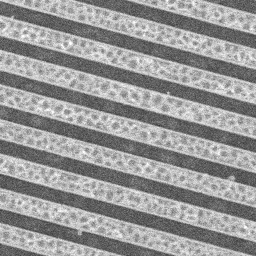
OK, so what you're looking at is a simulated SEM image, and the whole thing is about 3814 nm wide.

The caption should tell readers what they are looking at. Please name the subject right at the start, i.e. parallel lines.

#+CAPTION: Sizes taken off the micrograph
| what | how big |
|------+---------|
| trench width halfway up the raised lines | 0.225 um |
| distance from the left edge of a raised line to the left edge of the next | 0.498 microns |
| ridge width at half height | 275 nm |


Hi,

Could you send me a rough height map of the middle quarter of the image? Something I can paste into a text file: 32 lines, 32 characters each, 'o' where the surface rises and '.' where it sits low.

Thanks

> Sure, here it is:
..............ooooooooooooooooo.
oo...............ooooooooooooooo
ooooo...............oooooooooooo
ooooooooo...............oooooooo
ooooooooooooo...............oooo
ooooooooooooooooo...............
...ooooooooooooooooo............
.......ooooooooooooooooo........
...........ooooooooooooooooo....
..............oooooooooooooooooo
oooo..............oooooooooooooo
ooooooo..............ooooooooooo
ooooooooooo..............ooooooo
ooooooooooooooo...............oo
.oooooooooooooooooo.............
.....ooooooooooooooooo..........
........oooooooooooooooooo......
............oooooooooooooooooo..
o...............oooooooooooooooo
ooooo..............ooooooooooooo
oooooooo...............ooooooooo
oooooooooooo...............ooooo
oooooooooooooooo...............o
...ooooooooooooooooo............
......ooooooooooooooooo.........
..........ooooooooooooooooo.....
..............ooooooooooooooooo.
ooo...............oooooooooooooo
ooooooo..............ooooooooooo
ooooooooo................ooooooo
ooooooooooooo................ooo
ooooooooooooooooo...............